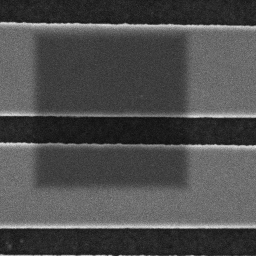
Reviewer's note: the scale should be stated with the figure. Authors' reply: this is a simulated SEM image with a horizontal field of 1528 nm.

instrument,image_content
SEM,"lines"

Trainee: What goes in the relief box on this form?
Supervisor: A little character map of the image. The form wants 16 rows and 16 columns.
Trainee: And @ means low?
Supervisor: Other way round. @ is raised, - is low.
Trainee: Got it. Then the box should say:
----------------
@@@@@@----------
@@@@@@@@@@@@@@@@
@@@@@@@@@@@@@@@@
@@@@@@@@@@@@@@@@
@@@@@@@@@@@@@@@@
@@@@@@@@@@@@@@@@
----------------
----------------
@@@@@@@@@@@@@@@@
@@@@@@@@@@@@@@@@
@@@@@@@@@@@@@@@@
@@@@@@@@@@@@@@@@
@@@@@@@@@@@@@@@@
----------------
----------------